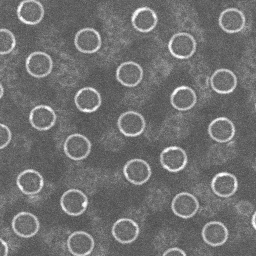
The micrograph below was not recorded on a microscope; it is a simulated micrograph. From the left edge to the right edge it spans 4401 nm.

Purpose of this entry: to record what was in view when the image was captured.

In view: a regular array of raised bodies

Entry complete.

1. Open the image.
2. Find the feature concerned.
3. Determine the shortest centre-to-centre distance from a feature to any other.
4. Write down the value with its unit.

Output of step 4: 785 nanometers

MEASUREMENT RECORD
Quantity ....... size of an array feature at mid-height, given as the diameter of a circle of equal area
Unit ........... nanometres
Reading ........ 422